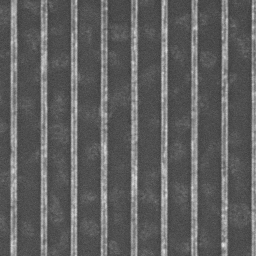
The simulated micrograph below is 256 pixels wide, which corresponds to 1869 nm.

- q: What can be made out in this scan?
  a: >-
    parallel lines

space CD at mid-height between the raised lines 185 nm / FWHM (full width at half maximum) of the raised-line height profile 5.25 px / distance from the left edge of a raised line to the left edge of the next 220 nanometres